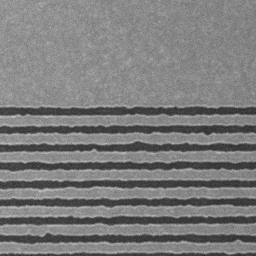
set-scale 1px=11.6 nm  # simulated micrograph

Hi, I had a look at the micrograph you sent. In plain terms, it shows parallel lines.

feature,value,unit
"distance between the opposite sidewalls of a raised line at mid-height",0.113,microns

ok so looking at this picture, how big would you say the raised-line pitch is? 211 nm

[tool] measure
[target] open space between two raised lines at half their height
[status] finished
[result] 92.7 nanometers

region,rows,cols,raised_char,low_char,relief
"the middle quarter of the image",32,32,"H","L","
HHHHHHHHHHHHHHHHHHHHHHHHHHHHHHHH
HHHHHHHHHHHHHHHHHHHHHHHHHHHHHHHH
HHHHHHHHHHHHHHHHHHHHHHHHHHHHHHHH
HHHHHHHHHHHHHHHHHHHHHHHHHHHHHHHH
HHHHHHHHHHHHHHHHHHHHHHHHHHHHHHHH
HHHHHHHHHHHHHHHHHHHHHHHHHHHHHHHH
HHHHHHHHHHHHHHHHHHHHHHHHHHHHHHHH
HHHHHHHHHHHHHHHHHHHHHHHHHHHHHHHH
HHHHHHHHHHHHHHHHHHHHHHHHHHHHHHHH
HHHHHHHHHHHHHHHHHHHHHHHHHHHHHHHH
HHHHHHHHHHHHHHHHHHLHHHHHHHHHHHHH
LLLLLLLLLLLLLLLLLLLLLLLLLLLLLLLL
LLLLLLLLLLLLLLLLLLLLLLLLLLLLLLLL
HHHHHHHHHHHHHHHHHHHHHHHHHHHHHHHH
HHHHHHHHHHHHHHHHHHHHHHHHHHHHHHHH
LHHLLLHHLLHLLLLHLLLLLLLLLLLLLLLL
LLLLLLLLLLLLLLLLLLLLLLLLLLLLLLLL
LHHHHLLLLHLLLHLHHHHLLLHHHHHHHHHH
HHHHHHHHHHHHHHHHHHHHHHHHHHHHHHHH
HHHHHHHHHHHHHHHHHLLLLHHHHHHHHHHH
LLLLLLLLLLLLLLLLLLLLLLLLLLLLLLLL
LLLLLLLLLLLLLLLLLLLLLLLLLLLLLLLL
HHHHHHHHHHHHHHHHHHHHHHHHHHHHHHHH
HHHHHHHHHHHHHHHHHHHHHHHHHHHHHHHH
LLLLLLLLLLLLLLLLLHHHLHHLLHHLLLLL
LLLLLLLLLLLLLLLLLLLLLLLLLLLLLLLL
LLLLLHHLLLLLHLLLHLLHHLLHLLLHLHHH
HHHHHHHHHHHHHHHHHHHHHHHHHHHHHHHH
HHHHHHHHHHHHHHHHHHHHHHHHHHHHHHHH
LLLLLLLLLLLLLLLLLLLLLLLLLLLLLLLL
LLLLLLLLLLLLLLLLLLLLLLLLLLLLLLLL
HHHHHHHHHHHHHHHHHHHHHHHHHHHHHHHH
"